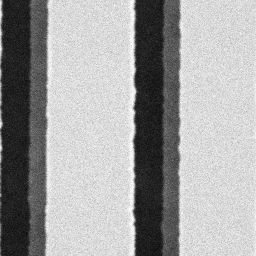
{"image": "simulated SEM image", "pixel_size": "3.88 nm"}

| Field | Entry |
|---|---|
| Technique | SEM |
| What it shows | lines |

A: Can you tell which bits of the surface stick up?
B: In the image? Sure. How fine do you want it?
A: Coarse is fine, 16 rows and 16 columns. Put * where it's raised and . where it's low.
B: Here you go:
..******..******
..******..******
..******..******
..******..******
..******..******
..******..******
..******..******
..******..******
..******..******
..******..******
..******..******
..******..******
..******..******
..******..******
..******..******
..******..******